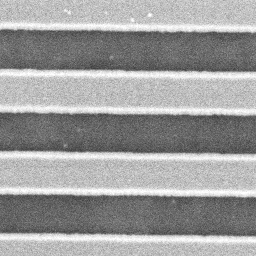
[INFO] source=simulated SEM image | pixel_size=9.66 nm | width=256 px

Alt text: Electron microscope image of lines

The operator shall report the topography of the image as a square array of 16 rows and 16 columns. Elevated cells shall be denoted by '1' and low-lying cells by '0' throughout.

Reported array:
1111111111111111
1111111111111111
0000000000000000
0000000000000000
1110000000000000
1111111111111111
1111111111111111
0000000000000000
0000000000000000
0000000000000000
1111111111111111
1111111111111111
0000000000000000
0000000000000000
0000000000000000
1111111111111111